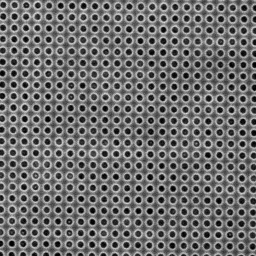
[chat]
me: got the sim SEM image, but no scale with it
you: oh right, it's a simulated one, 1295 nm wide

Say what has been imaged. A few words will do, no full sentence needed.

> a regular array of holes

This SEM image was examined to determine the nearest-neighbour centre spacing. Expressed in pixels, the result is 11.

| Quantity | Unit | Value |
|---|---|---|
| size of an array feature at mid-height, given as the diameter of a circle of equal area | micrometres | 0.0333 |